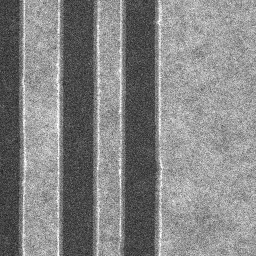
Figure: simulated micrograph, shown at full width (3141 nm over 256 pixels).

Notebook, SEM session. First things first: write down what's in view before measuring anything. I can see one or a few lines or trenches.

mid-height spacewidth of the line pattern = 437 nanometers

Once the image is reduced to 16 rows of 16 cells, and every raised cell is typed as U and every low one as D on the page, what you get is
DUUUDDUUDDUUUUUU
DUUUDDUUDDUUUUUU
DUUUDDUUDDUUUUUU
DUUUDDUUDDUUUUUU
DUUUDDUUDDUUUUUU
DUUUDDUUDDUUUUUU
DUUUDDUUDDUUUUUU
DUUUDDUUDDUUUUUU
DUUUDDUUDDUUUUUU
DUUUDDUUDDUUUUUU
DUUUDDUUDDUUUUUU
DUUUDDUUDDUUUUUU
DUUUDDUUDDUUUUUU
DUUUDDUUDDUUUUUU
DUUUDDUUDDUUUUUU
DUUUDDUUDDUUUUUU